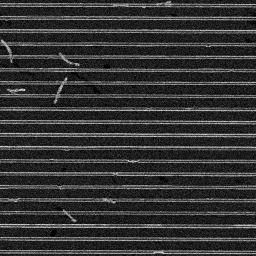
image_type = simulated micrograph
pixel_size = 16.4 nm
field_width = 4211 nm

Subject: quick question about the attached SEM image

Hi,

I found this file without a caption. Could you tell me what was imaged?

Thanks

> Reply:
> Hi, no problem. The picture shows parallel lines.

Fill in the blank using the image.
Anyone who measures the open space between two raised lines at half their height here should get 166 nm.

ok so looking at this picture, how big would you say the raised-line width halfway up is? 45.2 nanometres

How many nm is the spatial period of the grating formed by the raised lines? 213